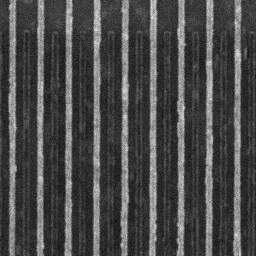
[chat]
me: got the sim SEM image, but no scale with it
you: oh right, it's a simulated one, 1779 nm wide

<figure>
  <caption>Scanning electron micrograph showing parallel lines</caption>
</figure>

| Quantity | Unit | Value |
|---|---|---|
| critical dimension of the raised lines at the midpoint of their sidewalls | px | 5.87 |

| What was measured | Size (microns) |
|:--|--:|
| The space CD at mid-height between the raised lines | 0.0582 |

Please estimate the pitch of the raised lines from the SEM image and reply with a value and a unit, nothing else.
97.8 nanometres